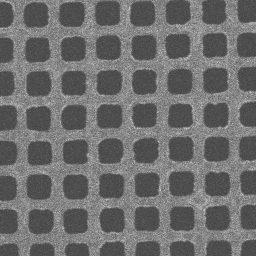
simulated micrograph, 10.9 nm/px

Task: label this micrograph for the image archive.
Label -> a regular array of holes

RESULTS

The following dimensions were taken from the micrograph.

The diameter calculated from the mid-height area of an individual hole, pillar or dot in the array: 0.293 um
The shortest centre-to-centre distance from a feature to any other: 371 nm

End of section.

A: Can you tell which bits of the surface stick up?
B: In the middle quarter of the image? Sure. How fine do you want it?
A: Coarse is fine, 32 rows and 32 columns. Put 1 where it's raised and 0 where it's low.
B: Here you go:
11111111111111111111111111111111
11111111110001111110001111100001
00000111000000111000000111000000
00000011000000111000000111000000
00000111000000111000000111000000
00000111000000111000000111000000
00000011000000111000000111000000
00000111100001111100001111100001
11111111111111111111111111111111
11111111111111111111111111111111
10000111100000111000000111100000
00000011000000011000000111000000
00000011000000011000000111000000
00000011000000011000000111000000
00000011000000111000000111000000
00000111000000111000000111000000
10111111111111111111111111111111
11111111111111111111111111111111
11111111111001111111000111100000
00000011100000011100000011000000
00000011000000011000000011000000
00000011000000011000000011000000
00000011000000011000000011000000
00000011100000111000000111000000
00000011100000111100001111110001
11111111111111111111111111111111
11111111111111111111111111111111
10111111110000111110000111100000
00000011100000011100000011000000
00000011100000011100000011000000
00000011100000011100000011000000
00000011100000011100000011000000